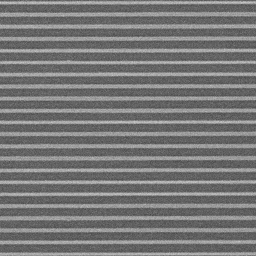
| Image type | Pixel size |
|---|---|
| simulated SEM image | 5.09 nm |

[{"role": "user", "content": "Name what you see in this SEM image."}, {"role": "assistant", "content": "parallel lines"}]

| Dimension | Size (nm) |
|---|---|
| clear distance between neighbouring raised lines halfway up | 42.6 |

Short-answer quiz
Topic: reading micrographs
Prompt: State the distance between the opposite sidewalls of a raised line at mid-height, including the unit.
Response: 19.1 nanometres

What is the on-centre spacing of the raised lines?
0.0609 µm